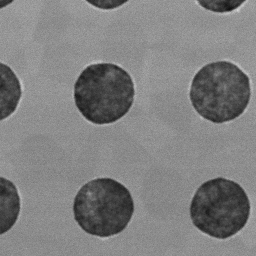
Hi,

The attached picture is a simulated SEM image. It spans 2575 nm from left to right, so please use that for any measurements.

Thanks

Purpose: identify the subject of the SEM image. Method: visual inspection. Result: holes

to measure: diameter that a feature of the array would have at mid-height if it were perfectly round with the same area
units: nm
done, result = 614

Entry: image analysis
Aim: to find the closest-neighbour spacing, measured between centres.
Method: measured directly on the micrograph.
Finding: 1160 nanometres